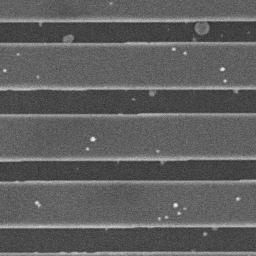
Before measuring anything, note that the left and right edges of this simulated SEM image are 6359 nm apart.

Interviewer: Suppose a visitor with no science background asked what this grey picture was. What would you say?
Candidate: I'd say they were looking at lines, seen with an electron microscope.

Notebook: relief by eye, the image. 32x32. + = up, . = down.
++++++++++++++++++++++++++++++++
++++++++++++++++++++++++++++++++
++++++++++++++++++++++++++++++++
................................
................................
++++++++++++++++++++++++++++++++
++++++++++++++++++++++++++++++++
++++++++++++++++++++++++++++++++
++++++++++++++++++++++++++++++++
++++++++++++++++++++++++++++++++
++++++++++++++++++++++++++++++++
................................
................................
................................
++++++++++++++++++++++++++++++++
++++++++++++++++++++++++++++++++
++++++++++++++++++++++++++++++++
++++++++++++++++++++++++++++++++
++++++++++++++++++++++++++++++++
++++++++++++++++++++++++++++++++
................................
................................
................................
++++++++++++++++++++++++++++++++
++++++++++++++++++++++++++++++++
++++++++++++++++++++++++++++++++
++++++++++++++++++++++++++++++++
++++++++++++++++++++++++++++++++
................................
................................
................................
................................